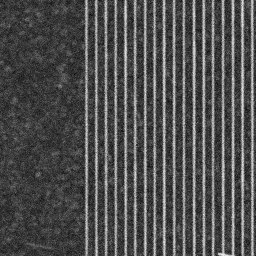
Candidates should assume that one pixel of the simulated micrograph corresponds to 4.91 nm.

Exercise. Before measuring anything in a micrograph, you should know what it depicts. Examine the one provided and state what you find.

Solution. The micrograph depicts parallel lines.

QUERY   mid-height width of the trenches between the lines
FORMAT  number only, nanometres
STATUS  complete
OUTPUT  41.1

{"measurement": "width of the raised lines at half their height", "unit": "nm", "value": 6.7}